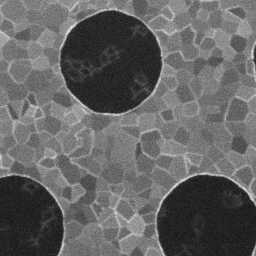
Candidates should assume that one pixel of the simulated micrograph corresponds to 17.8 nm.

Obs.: holes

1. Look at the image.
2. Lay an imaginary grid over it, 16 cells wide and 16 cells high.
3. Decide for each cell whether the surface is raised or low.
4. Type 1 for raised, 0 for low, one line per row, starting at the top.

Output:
1111111111111111
1111100001111111
1111000000111111
1111000000111111
1111000000111111
1111000000111111
1111100001111111
1111111111111111
1111111111111111
1111111111111111
1111111111111111
0001111111100001
0001111111000000
0000111111000000
0000111111000000
0000111111000000